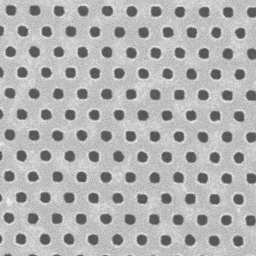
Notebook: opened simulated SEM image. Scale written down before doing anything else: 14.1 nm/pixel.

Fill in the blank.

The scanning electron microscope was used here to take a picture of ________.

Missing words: a regular array of holes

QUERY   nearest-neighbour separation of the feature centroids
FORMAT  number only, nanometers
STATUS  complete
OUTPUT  334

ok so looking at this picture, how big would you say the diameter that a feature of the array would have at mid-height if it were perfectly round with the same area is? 162 nanometers